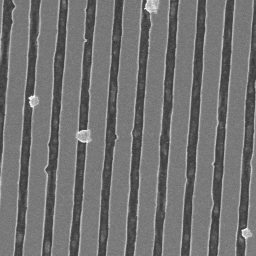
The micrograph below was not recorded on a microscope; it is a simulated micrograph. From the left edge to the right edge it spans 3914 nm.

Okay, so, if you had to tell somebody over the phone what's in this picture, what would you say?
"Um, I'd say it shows parallel lines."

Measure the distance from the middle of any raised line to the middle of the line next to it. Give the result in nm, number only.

423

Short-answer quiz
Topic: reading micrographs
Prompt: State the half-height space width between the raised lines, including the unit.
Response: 9.1 px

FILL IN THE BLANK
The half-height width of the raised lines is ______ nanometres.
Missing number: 278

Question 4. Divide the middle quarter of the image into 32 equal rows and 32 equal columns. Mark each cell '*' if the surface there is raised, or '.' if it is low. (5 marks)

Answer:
****...*****..****...****...****
****...****...****...****...****
****...****...****...****...****
****...****..*****...****...****
****...****..*****...****..*****
****...****...****...****..*****
****..*****...****..*****..*****
****..*****...****..*****..*****
****...****..*****..*****..*****
****...****..*****..*****..****.
****..*****..*****..*****..****.
****..*****..*****..*****..****.
****..*****..*****..****...****.
****..****...*****..****...****.
****..****...****...****...****.
***...*****..****...****...****.
****.*****...****...****...****.
**********...****...****...****.
**********...****...****...****.
***..*****...****...****...****.
***...****...****...****...****.
***...****...****..*****...****.
***...****...****..*****..*****.
***...****..*****..*****..*****.
***...****..*****..*****..****..
***..*****..****...*****..*****.
***..*****..****...*****..*****.
***..****...****...****...****..
***..****...****...****...*****.
***..****...****...****...*****.
**...****...****...****...****..
**...****...****...****...****..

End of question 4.